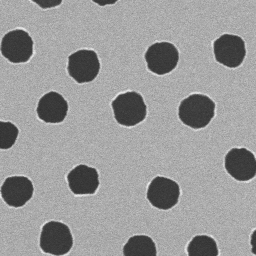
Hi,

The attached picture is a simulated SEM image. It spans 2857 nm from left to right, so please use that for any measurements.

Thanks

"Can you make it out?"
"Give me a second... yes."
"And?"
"a regular array of holes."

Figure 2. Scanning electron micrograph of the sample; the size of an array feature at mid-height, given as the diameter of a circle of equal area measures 367 nanometres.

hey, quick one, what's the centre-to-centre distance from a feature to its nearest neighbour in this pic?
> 729 nanometers